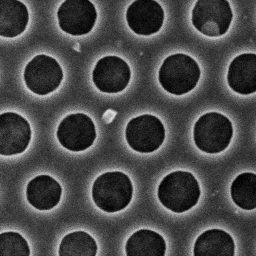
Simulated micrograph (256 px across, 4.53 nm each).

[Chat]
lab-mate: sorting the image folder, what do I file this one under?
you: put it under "a regular array of holes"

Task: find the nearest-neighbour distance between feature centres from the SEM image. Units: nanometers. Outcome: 302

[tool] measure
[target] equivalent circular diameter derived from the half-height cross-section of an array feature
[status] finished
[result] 177 nm